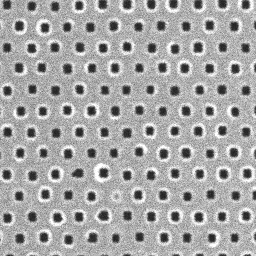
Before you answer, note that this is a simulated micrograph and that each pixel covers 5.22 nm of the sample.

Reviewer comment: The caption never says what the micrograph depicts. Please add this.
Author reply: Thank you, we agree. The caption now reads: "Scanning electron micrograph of a regular array of holes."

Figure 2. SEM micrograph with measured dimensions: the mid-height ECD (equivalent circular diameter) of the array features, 47.5 nanometres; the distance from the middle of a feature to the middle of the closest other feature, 0.119 µm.